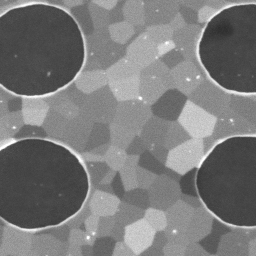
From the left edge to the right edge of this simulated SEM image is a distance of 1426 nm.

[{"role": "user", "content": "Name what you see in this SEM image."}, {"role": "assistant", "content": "holes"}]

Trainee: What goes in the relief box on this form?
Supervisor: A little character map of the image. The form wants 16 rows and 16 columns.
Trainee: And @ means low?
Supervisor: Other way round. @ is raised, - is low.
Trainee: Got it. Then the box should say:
@---@@@@@@@@@@--
-----@@@@@@@@---
-----@@@@@@@@---
-----@@@@@@@----
-----@@@@@@@@---
----@@@@@@@@@@--
@@@@@@@@@@@@@@@@
@@@@@@@@@@@@@@@@
@@@@@@@@@@@@@@@@
----@@@@@@@@@---
-----@@@@@@@----
------@@@@@@----
-----@@@@@@@@---
----@@@@@@@@@@--
@@@@@@@@@@@@@@@@
@@@@@@@@@@@@@@@@